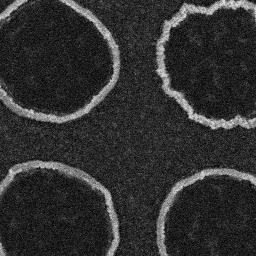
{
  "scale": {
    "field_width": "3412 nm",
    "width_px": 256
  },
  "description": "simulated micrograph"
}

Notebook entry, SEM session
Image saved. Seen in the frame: raised bodies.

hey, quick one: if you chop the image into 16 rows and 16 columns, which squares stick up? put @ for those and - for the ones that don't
-@@@@--------@@@
@@@@@@-----@@@@@
@@@@@@@---@@@@@@
@@@@@@@---@@@@@@
@@@@@@@---@@@@@@
@@@@@@@----@@@@@
-@@@@@------@@@@
-------------@@@
----------------
----------------
-@@@------------
@@@@@@-----@@@@@
@@@@@@@----@@@@@
@@@@@@@---@@@@@@
@@@@@@@---@@@@@@
@@@@@@@---@@@@@@